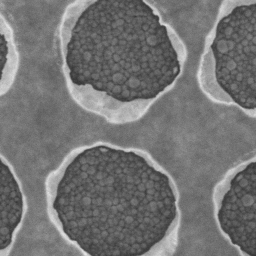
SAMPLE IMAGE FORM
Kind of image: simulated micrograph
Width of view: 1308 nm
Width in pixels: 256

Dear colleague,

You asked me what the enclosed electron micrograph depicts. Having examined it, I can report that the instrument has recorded holes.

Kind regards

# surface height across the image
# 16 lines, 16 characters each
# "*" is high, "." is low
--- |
*****....*****..
****......****..
****.......**...
.***.......**...
****.......**...
*****.....***...
******..*******.
****************
****************
*****...********
.***......*****.
.**........***..
.**........***..
.**........***..
.***.......***..
*****.....*****.